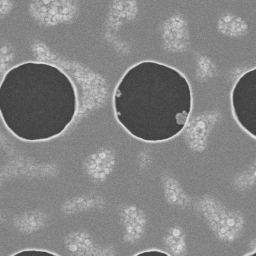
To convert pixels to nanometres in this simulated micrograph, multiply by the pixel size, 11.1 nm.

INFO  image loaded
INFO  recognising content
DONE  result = holes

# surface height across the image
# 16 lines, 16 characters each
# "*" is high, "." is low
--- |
****************
****************
****************
****************
*...****...*****
.....**.....***.
.....**.....***.
....****....***.
*..******..*****
****************
****************
****************
****************
****************
****************
****************